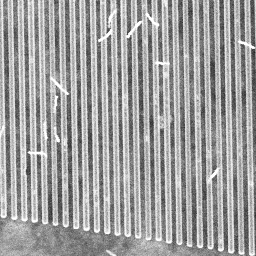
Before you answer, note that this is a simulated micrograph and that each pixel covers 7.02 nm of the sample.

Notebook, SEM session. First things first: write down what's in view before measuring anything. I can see parallel lines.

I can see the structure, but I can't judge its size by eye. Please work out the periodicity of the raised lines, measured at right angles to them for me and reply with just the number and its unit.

0.0723 um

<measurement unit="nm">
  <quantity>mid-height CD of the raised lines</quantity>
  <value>34.2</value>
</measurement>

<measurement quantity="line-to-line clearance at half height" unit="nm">34.2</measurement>